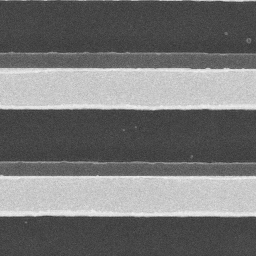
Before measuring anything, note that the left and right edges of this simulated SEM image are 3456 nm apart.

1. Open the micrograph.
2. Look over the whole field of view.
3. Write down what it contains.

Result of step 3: lines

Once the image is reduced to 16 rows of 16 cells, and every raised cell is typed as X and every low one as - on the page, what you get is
----------------
----------------
----------------
XXXXXXXXXXXXXXXX
XXXXXXXXXXXXXXXX
XXXXXXXXXXXXXXXX
XXXXXXXXXXXXXXXX
----------------
----------------
----------------
XXXXXXXXXXXXXXXX
XXXXXXXXXXXXXXXX
XXXXXXXXXXXXXXXX
----------------
----------------
----------------